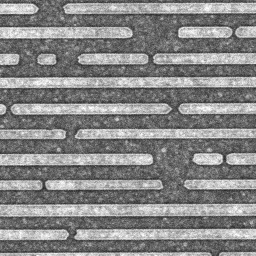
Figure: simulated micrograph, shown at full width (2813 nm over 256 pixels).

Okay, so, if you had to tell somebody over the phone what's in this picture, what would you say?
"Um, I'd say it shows parallel lines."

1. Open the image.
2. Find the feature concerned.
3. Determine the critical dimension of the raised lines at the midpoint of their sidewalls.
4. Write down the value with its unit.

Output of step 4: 102 nanometers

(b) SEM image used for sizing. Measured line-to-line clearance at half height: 170 nanometres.